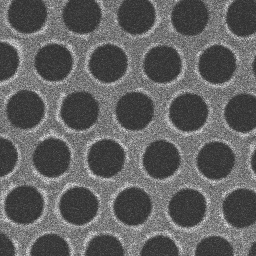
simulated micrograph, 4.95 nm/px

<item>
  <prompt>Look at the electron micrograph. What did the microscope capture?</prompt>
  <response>a regular array of holes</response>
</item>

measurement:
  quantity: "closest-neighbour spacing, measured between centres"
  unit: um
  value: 0.268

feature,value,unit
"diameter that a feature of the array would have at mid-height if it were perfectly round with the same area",0.192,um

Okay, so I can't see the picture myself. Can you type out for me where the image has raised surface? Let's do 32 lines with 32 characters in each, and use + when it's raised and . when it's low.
+.....++....+++....+++....+++...
+.....++.....++....+++....++....
+.....++.....++....++.....++....
++...+++....+++....+++....+++...
++++++++++++++++++++++++++++++.+
.+++++.+++++++++++++++++++++++++
..+++....+++....+++...+++....+++
..++.....++.....++.....++....+++
..++.....++.....++.....++.....++
..+++...++++...+++....+++....+++
++++++++++++++++++++++++++++++++
++..++++++.+++++++++++++++++++++
+....+++....+++....+++...++++...
+.....++....+++....++.....++....
+....+++....++.....++.....++....
+....+++....+++....+++...+++....
++++++++++++++++++++++++++++++.+
.+++++.++++++.++++++++++++++++++
..++.....++....+++....+++....+++
..++.....++.....++.....++....++.
..++.....++....+++....+++....++.
.++++...++++...+++....+++....+++
++++++++++++++++++++++++++++++++
++..+++++..+++++.+++++++++++++++
+....+++....+++....+++...+++....
+....++.....++.....++.....++....
+....++.....++.....++.....++....
+....+++...++++...++++...+++....
++++++++++++++++++++++++++++++++
.++++..+++++..+++++..+++++++++++
..++....+++....+++....+++....+++
..++.....++.....++....++.....++.